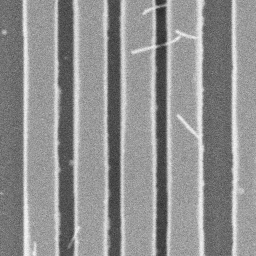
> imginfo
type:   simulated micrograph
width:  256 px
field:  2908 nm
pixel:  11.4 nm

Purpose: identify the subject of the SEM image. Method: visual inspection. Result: lines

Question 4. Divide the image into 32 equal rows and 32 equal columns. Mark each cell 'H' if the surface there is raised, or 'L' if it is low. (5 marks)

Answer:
LLLHHHHLLHHHHLLHHHHHLHHHHLLLLHHH
LLLHHHHLLHHHHLLHHHHLLHHHHLLLLHHH
LLLHHHHLLHHHHLLHHHHLLHHHHLLLLHHH
LLLHHHHLLHHHHLLHHHHLLHHHHLLLLHHH
LLLHHHHLLHHHHLLHHHHLLHHHHLLLLHHH
LLLHHHHLLHHHHLLHHHHHLHHHHLLLLHHH
LLLHHHHLLHHHHLLHHHHLLHHHHLLLLHHH
LLLHHHHLLHHHHLLHHHHLLHHHHLLLLHHH
LLLHHHHLLHHHHLLHHHHLLHHHHLLLLHHH
LLLHHHHLLHHHHLLHHHHLLHHHHLLLLHHH
LLLHHHHLLHHHHLLHHHHLLHHHHLLLLHHH
LLLHHHHLLHHHHLLHHHHLLHHHHLLLLHHH
LLLHHHHLLHHHHLLHHHHLLHHHHLLLLHHH
LLLHHHHLLHHHHLLHHHHLLHHHHLLLLHHH
LLLHHHHLLHHHHLLHHHHLLHHHHLLLLHHH
LLLHHHHLLHHHHLLHHHHLLHHHHLLLLHHH
LLLHHHHLLHHHHLLHHHHLLHHHHLLLLHHH
LLLHHHHLLHHHHLLHHHHLLHHHHLLLLHHH
LLLHHHHLLHHHHLLHHHHLLHHHHLLLLHHH
LLLHHHHLLHHHHLLHHHHLLHHHHLLLLHHH
LLLHHHHLLHHHHLLHHHHLLHHHHLLLLHHH
LLLHHHHLLHHHHLLHHHHLLHHHHLLLLHHH
LLLHHHHLLHHHHLLHHHHLLHHHHLLLLHHH
LLLHHHHLLHHHHLLHHHHLLHHHHLLLLHHH
LLLHHHHLLHHHHLLHHHHLLHHHHLLLLHHH
LLLHHHHLLHHHHLLHHHHLLHHHHLLLLHHH
LLLHHHHLLHHHHLLHHHHLLHHHHLLLLHHH
LLLHHHHLLHHHHLLHHHHLLHHHHLLLLHHH
LLLHHHHLLHHHHLLHHHHLLHHHHLLLLHHH
LLLHHHHLLHHHHLLHHHHLLHHHHLLLLHHH
LLLHHHHLLHHHHLLHHHHLLHHHHLLLLHHH
LLLHHHHLLHHHHLLHHHHLLHHHHLLLLHHH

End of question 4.